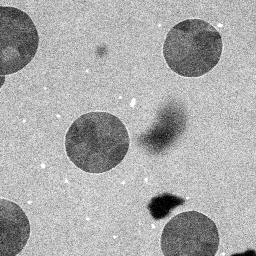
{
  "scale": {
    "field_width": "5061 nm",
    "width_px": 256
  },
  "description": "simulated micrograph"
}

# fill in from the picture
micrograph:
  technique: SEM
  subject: raised bodies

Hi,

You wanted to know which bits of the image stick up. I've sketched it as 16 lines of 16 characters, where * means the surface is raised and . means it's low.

*...............
**.........**...
**........****..
**........****..
*..........**...
................
................
.....***........
....****........
....****........
.....**.........
................
*...............
**.........**...
**........****..
*.........****..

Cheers